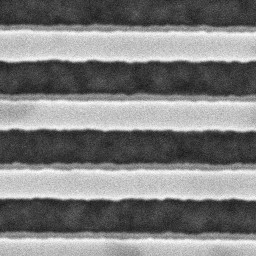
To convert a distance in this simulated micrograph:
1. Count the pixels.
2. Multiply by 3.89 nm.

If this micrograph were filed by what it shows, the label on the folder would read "lines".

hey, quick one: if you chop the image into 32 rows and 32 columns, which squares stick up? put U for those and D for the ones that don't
DDDDDDDDDDDDDDDDDDDDDDDDDDDDDDDD
DDDDDDDDDDDDDDDDDDDDDDDDDDDDDDDD
DDDDDDDDDDDDDDDDDDDDDDDDDDDDDDDD
UUUUUUUUUUUUUUUUUUUUUUUUUUUUUUUU
UUUUUUUUUUUUUUUUUUUUUUUUUUUUUUUU
UUUUUUUUUUUUUUUUUUUUUUUUUUUUUUUU
UUUUUUUUUUUUUUUUUUUUUUUUUUUUUUUU
UUUUUDDDUUUDUUUUUUUUUUDUUUUUUUUU
DDDDDDDDDDDDDDDDDDDDDDDDDDDDDDDD
DDDDDDDDDDDDDDDDDDDDDDDDDDDDDDDD
DDDDDDDDDDDDDDDDDDDDDDDDDDDDDDDD
DDDDDDDDDDDDDDDDDDDDDDDDDDDDDDDD
UUUUUUUUUUUUUUUUUUUUUUUUUUUUUUUU
UUUUUUUUUUUUUUUUUUUUUUUUUUUUUUUU
UUUUUUUUUUUUUUUUUUUUUUUUUUUUUUUU
UUUUUUUUUUUUUUUUUUUUUUUUUUUUUUUU
DDDDDDDDDDDDDDDDDDDDDDDDDDDDDDDD
DDDDDDDDDDDDDDDDDDDDDDDDDDDDDDDD
DDDDDDDDDDDDDDDDDDDDDDDDDDDDDDDD
DDDDDDDDDDDDDDDDDDDDDDDDDDDDDDDD
DDDDDDDUDUDDDUDDDDDDDDDDDDDDDUDD
UUUUUUUUUUUUUUUUUUUUUUUUUUUUUUUU
UUUUUUUUUUUUUUUUUUUUUUUUUUUUUUUU
UUUUUUUUUUUUUUUUUUUUUUUUUUUUUUUU
UUUUUUUUUUUUUUUUUUUUUUUUUUUUUUUU
DDDDDDDDDDDDDDDDDDDDDDDDDDDDDDDD
DDDDDDDDDDDDDDDDDDDDDDDDDDDDDDDD
DDDDDDDDDDDDDDDDDDDDDDDDDDDDDDDD
DDDDDDDDDDDDDDDDDDDDDDDDDDDDDDDD
UUUUUUUUUUUUUUUUUUUUUUUUUUUUUUUU
UUUUUUUUUUUUUUUUUUUUUUUUUUUUUUUU
UUUUUUUUUUUUUUUUUUUUUUUUUUUUUUUU